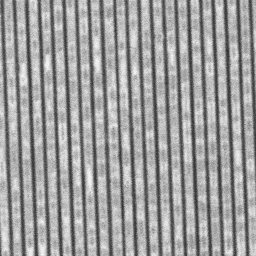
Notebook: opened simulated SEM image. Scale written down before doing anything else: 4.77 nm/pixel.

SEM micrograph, parallel lines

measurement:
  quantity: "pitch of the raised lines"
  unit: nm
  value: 59.2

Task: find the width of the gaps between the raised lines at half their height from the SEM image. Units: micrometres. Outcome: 0.0203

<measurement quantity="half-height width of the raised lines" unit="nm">39.9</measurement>